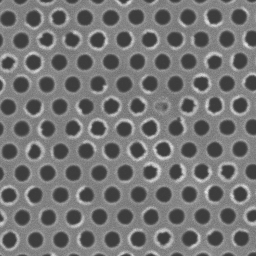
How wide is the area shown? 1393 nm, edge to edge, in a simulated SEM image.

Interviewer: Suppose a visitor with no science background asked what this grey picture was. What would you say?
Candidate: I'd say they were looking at a regular array of holes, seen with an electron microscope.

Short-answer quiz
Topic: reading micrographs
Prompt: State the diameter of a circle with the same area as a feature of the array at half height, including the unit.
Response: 82.8 nm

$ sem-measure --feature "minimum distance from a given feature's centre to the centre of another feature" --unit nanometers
136